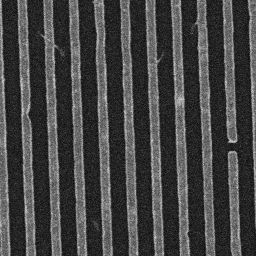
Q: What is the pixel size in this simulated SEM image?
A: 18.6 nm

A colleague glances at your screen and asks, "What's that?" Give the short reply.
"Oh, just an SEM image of parallel lines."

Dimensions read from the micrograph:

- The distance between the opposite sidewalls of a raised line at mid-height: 158 nm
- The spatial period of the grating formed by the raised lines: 475 nm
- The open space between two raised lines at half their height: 317 nanometers